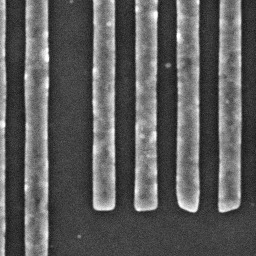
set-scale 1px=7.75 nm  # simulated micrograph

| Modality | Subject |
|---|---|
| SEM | wiring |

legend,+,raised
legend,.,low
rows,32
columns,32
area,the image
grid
+..+++......++...+++..+++...++..
+..+++......++...+++..+++...++..
+..+++......++...+++..+++...++..
+..+++......++...+++..+++...++..
+..+++......++...+++..+++...++..
+..+++......++...+++..+++...++..
+..+++......++...+++..+++..+++..
+..+++......++...+++..+++..+++..
+..+++......++...+++..+++..+++..
+..+++......++...+++..+++..+++..
+..+++......++...+++..+++..+++..
+..+++......++...++...+++..+++..
+..+++......++...+++..+++..+++..
+..+++......++...+++..+++..+++..
+..+++......++...+++..+++..+++..
+..+++......++...++...+++..+++..
+..+++......++...++...+++..+++..
+..+++......++...+++..+++..+++..
+..+++......++...+++..+++..+++..
+..+++......++...+++..+++...++..
+..+++......++...+++..+++...++..
+..+++......++...+++..+++..+++..
+..+++......++...+++..+++..+++..
+..+++......++...+++..+++..+++..
+..+++......++...+++..+++..+++..
+..+++......++...+++..+++..+++..
+..+++..........................
+..+++..........................
+..+++..........................
+..+++..........................
+..+++..........................
+..+++..........................